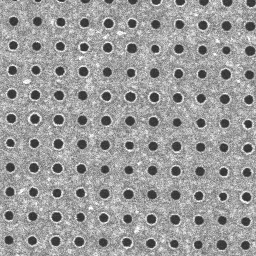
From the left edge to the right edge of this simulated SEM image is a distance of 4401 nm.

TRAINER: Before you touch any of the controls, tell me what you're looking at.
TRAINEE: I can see a regular array of holes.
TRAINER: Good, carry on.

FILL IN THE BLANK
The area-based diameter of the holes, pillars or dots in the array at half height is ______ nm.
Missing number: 160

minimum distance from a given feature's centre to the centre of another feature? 403 nanometers